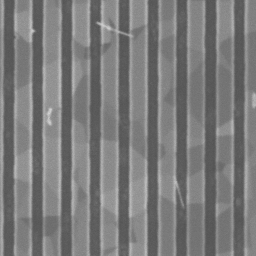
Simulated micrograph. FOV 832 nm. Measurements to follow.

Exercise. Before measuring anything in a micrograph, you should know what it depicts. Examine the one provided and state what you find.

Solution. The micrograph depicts parallel lines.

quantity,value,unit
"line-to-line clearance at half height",12.9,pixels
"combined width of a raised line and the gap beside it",93.8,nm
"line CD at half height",52.9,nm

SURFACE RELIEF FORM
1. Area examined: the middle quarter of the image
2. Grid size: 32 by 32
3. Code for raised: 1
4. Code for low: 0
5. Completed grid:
00111100001110000111000011110001
00111100001110000111000011110001
00111100001110000111000011110001
00111100001110000111000011110001
00111100001110000111000011110001
00111100001110000111100011110001
00111100001110000111100011110001
00111100001110000111100011110001
00111100001110000111000011110001
00111100001110000111000011110001
00111100001110000111100011110001
00111100001110000111100011110001
00111100001110000111100011110001
00111100001110000111000011110001
00111100001110000111000011110001
00111100001110000111000011110001
00111100001110000111000011110001
00111100001110000111000011110001
00111100001110000111000011110001
00111100001110000111000011110001
00111100001110000111000011110001
00111100001110000111000011110001
00111100001110000111000011110001
00111100001110000111000011110001
00111100001110000111000011110001
00111100001110000111000011110001
00111100001110000111000011110001
00111100001110000111100011110001
00111100001110000111100011110001
00111100001110000111000011110001
00111100011110000111000011110001
00111100011110000111000011110001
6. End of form